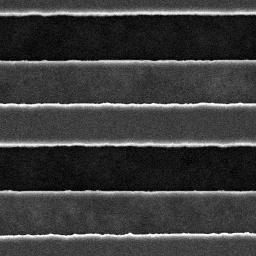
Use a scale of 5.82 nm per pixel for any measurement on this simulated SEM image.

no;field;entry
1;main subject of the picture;lines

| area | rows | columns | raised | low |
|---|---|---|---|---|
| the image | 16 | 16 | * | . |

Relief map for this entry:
****************
................
................
................
****************
****************
****************
****************
****************
................
................
................
****************
****************
****************
****************